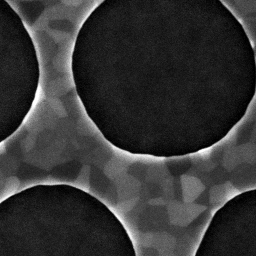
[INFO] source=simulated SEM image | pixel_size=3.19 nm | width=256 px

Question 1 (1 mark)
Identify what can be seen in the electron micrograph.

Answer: holes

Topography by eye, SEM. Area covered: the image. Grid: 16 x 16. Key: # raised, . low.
.#####........##
.####..........#
..###...........
..##............
..###...........
..###...........
..###...........
..####.........#
.######.......##
########....####
################
###.############
......########..
.......######...
........#####...
........####....